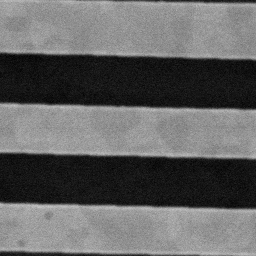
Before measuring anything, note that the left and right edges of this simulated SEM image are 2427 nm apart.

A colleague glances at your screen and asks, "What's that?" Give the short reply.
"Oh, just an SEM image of lines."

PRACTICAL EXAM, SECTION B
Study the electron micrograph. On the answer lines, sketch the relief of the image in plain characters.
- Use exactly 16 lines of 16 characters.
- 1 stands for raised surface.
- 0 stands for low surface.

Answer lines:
1111111111111111
1111111111111111
1111111111111111
0000000000111111
0000000000000000
0000000000000000
1000000000000000
1111111111111111
1111111111111111
1111111111111111
0000000000000000
0000000000000000
0000000000000000
1111111111111111
1111111111111111
1111111111111111